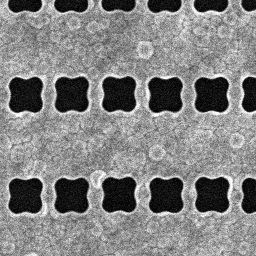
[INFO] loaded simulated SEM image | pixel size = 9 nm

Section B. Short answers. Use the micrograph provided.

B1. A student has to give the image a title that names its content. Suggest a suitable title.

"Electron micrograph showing a regular array of holes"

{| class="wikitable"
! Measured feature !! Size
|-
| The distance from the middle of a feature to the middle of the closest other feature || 0.416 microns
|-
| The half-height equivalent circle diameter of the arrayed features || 336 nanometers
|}